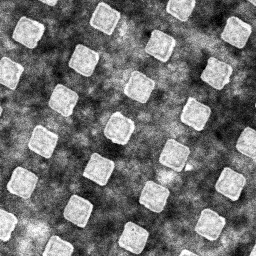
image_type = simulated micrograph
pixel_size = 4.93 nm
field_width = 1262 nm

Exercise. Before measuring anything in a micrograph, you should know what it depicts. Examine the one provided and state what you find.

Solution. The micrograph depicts a regular array of raised bodies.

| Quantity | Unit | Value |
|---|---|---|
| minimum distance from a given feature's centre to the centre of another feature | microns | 0.226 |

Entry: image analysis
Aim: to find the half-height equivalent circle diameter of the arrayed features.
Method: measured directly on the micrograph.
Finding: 27.9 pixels